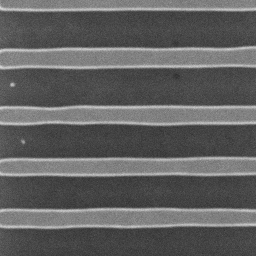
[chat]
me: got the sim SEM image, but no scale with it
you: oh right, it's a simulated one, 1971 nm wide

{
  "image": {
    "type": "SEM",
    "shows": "groups of lines, slits or small figures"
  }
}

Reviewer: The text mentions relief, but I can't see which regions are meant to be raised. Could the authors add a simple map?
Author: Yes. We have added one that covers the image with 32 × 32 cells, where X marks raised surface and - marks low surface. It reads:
XXXXXXXXXXXXXXXXXXXXXXXXXXXXXXXX
--------------------------------
--------------------------------
--------------------------------
--------------------------------
--------------------------------
XXXXXXXXXXXXXXXXXXXXXXXXXXXXXXXX
XXXXXXXXXXXXXXXXXXXXXXXXXXXXXXXX
XX------XXXX--------------------
--------------------------------
--------------------------------
--------------------------------
--------------------------------
XXXX----XXXXXXXXXXXXXXXXXXXXXXXX
XXXXXXXXXXXXXXXXXXXXXXXXXXXXXXXX
XXXXX-----------XXXXXXXXX--XX---
--------------------------------
--------------------------------
--------------------------------
--------------------------------
XXXXXXXXXXXXXXXXXXXXXXXXXXXXXXXX
XXXXXXXXXXXXXXXXXXXXXXXXXXXXXXXX
--------------------------------
--------------------------------
--------------------------------
--------------------------------
XXXXXXXXXXXXXXXXXXXXXXXXXXXXXXXX
XXXXXXXXXXXXXXXXXXXXXXXXXXXXXXXX
--------------------------------
--------------------------------
--------------------------------
--------------------------------